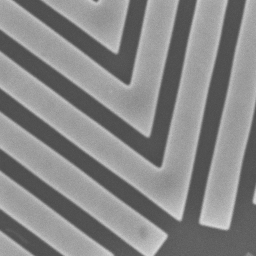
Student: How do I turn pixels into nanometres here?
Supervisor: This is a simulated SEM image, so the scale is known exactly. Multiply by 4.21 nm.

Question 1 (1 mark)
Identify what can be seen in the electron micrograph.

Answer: groups of lines, slits or small figures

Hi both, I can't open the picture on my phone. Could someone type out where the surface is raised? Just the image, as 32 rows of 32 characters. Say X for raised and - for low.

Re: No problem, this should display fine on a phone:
XX----XXXXXXXXXX--XXXX---XXX---X
XXXX---XXXXXXXXX--XXXX--XXXX---X
XXXXX----XXXXXXX--XXXX--XXXX--XX
XXXXXX----XXXXX---XXXX--XXXX--XX
-XXXXXXX---XXXX---XXX---XXXX--XX
---XXXXXX----XX--XXXX--XXXX---XX
----XXXXXX-------XXXX--XXXX--XXX
X----XXXXXXX-----XXXX--XXXX--XXX
XXX----XXXXXX----XXXX--XXXX--XXX
XXXX----XXXXXX---XXX---XXX---XXX
XXXXX----XXXXXXXXXXX--XXXX---XXX
-XXXXXX----XXXXXXXXX--XXXX--XXXX
--XXXXXX----XXXXXXXX--XXXX--XXXX
---XXXXXXX---XXXXXX---XXXX--XXXX
X----XXXXXX----XXXX---XXX---XXXX
XX----XXXXXX----XXX--XXXX--XXXX-
XXX----XXXXXXX---XX--XXXX--XXXX-
XXXXX----XXXXXX------XXXX--XXXX-
XXXXXX----XXXXXX-----XXXX--XXXX-
-XXXXXXX---XXXXXXX---XXX---XXX--
---XXXXXX----XXXXXX-XXXX--XXXX--
----XXXXXX----XXXXXXXXXX--XXXX--
XX---XXXXXXX----XXXXXXXX--XXXX--
XXX----XXXXXX----XXXXXXX--XXXX--
XXXX----XXXXXX----XXXXX---XXXX--
XXXXXX---XXXXXXX----XXX--XXXX---
-XXXXXX----XXXXXX----XX--XXXX---
--XXXXXX----XXXXXX-------XXXX---
---XXXXXXX----XXXXXX-------X----
X----XXXXXX----XXXXXX-----------
XX----XXXXXX----XXXX------------
XXXX---XXXXXXX---XXX------------